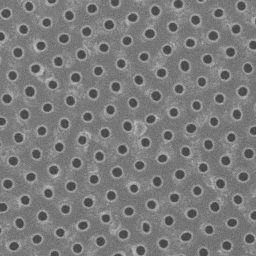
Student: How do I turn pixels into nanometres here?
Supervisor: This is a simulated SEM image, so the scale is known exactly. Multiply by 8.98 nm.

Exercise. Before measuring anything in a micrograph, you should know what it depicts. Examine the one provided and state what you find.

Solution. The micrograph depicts a regular array of holes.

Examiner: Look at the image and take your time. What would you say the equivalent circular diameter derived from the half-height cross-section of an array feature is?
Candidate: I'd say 0.0877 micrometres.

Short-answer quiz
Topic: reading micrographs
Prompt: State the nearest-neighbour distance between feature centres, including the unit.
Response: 211 nm